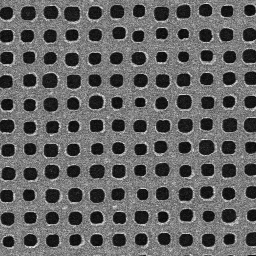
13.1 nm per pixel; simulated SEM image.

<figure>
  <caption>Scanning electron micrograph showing a regular array of holes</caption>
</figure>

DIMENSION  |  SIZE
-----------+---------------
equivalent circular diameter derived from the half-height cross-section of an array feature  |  178 nm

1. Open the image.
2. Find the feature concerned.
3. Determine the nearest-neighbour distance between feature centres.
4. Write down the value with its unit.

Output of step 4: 281 nanometers